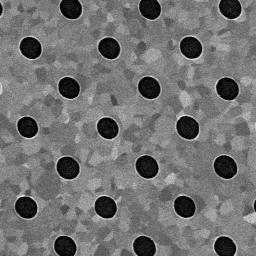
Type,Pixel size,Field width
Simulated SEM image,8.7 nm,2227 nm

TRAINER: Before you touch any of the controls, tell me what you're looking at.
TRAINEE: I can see a regular array of holes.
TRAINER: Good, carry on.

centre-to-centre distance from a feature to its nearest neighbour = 479 nm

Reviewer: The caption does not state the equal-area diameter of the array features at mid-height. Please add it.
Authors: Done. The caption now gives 198 nm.